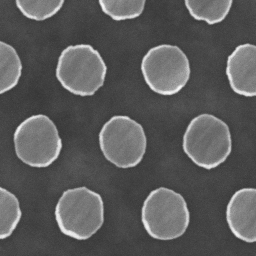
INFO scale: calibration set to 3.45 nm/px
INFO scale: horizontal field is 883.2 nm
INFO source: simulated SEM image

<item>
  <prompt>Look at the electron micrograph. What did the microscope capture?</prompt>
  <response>raised bodies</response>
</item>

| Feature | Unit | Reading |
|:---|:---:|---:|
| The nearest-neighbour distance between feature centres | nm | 287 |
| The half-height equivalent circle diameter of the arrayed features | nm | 170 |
